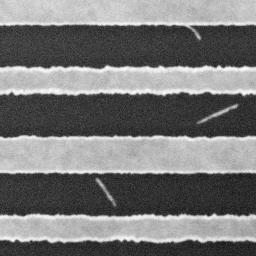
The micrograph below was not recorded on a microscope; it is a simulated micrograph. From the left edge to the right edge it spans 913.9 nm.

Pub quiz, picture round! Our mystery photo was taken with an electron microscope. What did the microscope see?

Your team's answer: lines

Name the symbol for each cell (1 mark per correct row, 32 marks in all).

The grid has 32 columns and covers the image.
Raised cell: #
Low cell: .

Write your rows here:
################################
################################
################################
................................
................................
................................
................................
................................
..#....###...#.#..#.####.####.#.
################################
################################
################################
................................
................................
................................
................................
................................
################################
################################
################################
################################
################################
................................
................................
................................
................................
................................
################################
################################
################################
................................
................................